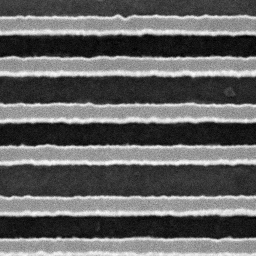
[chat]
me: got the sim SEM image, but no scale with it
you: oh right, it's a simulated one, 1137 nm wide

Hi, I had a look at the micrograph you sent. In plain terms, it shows lines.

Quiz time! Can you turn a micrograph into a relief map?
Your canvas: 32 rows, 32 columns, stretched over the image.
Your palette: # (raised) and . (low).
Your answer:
................................
................................
################################
################################
................................
................................
................................
################################
################################
###.####...##...###.#######.####
................................
................................
................................
################################
################################
................................
................................
................................
################################
################################
###.##########.###############.#
................................
................................
................................
................................
################################
################################
................................
................................
................................
################################
################################